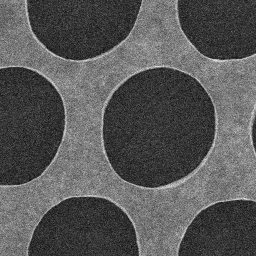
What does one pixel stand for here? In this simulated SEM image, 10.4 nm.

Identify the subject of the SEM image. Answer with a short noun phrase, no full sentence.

holes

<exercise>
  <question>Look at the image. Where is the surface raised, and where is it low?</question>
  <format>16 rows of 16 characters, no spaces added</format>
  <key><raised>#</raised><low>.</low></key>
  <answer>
##.......##.....
##......###.....
##......####....
####..#######...
..#######..#####
...####......###
....###......###
....##.......###
....##.......###
....###......###
...####.....####
.#######...#####
####...#########
###.....####....
##......####....
##.......##.....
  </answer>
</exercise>